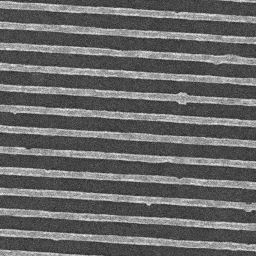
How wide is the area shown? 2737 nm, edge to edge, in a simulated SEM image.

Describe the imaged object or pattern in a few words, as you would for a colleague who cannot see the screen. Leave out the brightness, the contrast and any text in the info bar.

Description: parallel lines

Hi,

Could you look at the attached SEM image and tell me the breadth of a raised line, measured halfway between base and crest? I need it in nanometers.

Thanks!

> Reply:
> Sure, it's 72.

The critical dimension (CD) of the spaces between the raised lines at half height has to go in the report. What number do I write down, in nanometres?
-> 152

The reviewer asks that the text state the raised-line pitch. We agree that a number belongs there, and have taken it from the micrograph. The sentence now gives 0.221 µm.